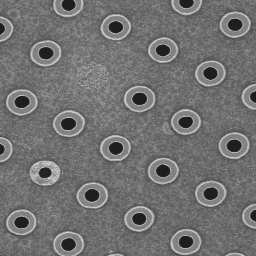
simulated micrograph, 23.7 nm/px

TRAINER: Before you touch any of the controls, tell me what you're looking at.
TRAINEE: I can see a regular array of ring-shaped raised bodies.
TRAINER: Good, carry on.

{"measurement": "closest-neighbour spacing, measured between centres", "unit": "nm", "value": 1240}